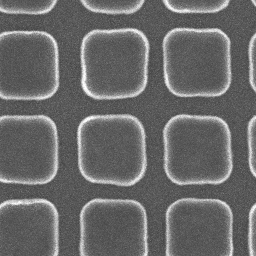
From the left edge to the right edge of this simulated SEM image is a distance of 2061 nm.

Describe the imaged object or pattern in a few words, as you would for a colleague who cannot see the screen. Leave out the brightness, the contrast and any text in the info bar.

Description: raised bodies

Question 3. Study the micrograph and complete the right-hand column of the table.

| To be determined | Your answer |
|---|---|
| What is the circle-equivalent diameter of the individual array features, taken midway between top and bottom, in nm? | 580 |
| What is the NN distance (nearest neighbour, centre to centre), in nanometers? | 677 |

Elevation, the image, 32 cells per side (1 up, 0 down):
11111110000111111100011111110000
00111000000001110000000000000000
00000000000000000000000000000000
00000000000000000000000000000000
11111100000111111100011111110000
11111110001111111100111111111001
11111110001111111100111111111001
11111110001111111100011111111001
11111110001111111100011111111001
11111110001111111100011111111001
11111110001111111100011111111000
11111110000111111000001111110000
00000000000000000000000000000000
00000000000000000000000000000000
00000000000000000000001000000000
11111110001111111000011111110001
11111110001111111100011111111001
11111110001111111100011111111001
11111110001111111100011111111001
11111110001111111100011111111001
11111110001111111100011111111001
11111110001111111100011111111000
11111100000111111000001111110000
00000000000000000000000000000000
00000000000000000000000000000000
11111100000111111000001111110000
11111110001111111100011111111001
11111110001111111100011111111001
11111110001111111100011111111001
11111110001111111100011111111001
11111110001111111100011111111001
11111110001111111100011111111001